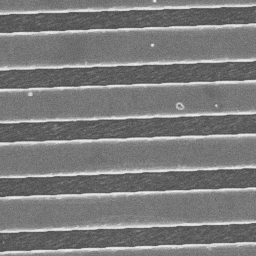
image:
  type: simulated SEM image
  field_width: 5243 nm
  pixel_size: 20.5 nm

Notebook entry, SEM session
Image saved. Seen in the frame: lines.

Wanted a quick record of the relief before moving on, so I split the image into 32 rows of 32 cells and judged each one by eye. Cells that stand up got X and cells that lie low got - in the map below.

XXXXXXXXXXXXXXXXXXXXXXXXXXXXXXXX
XXXXXXXXX-----------------------
--------------------------------
------------------XXXXXXXXXXXXXX
XXXXXXXXXXXXXXXXXXXXXXXXXXXXXXXX
XXXXXXXXXXXXXXXXXXXXXXXXXXXXXXXX
XXXXXXXXXXXXXXXXXXXXXXXXXXXXXXXX
XXXXXXXXXXXXXXXXXXXXXXXXXXXXXXXX
XXXXX---------------------------
--------------------------------
--------------------XXXXXXXXXXXX
XXXXXXXXXXXXXXXXXXXXXXXXXXXXXXXX
XXXXXXXXXXXXXXXXXXXXXXXXXXXXXXXX
XXXXXXXXXXXXXXXXXXXXXXXXXXXXXXXX
XXXXXXXXXXXXXXXXXXXXXX----------
--------------------------------
--------------------------------
------------XXXXXXXXXXXXXXXXXXXX
XXXXXXXXXXXXXXXXXXXXXXXXXXXXXXXX
XXXXXXXXXXXXXXXXXXXXXXXXXXXXXXXX
XXXXXXXXXXXXXXXXXXXXXXXXXXXXXXXX
XXXXXXXXXXXXXXXXXX--------------
--------------------------------
--------------------------------
----XXXXXXXXXXXXXXXXXXXXXXXXXXXX
XXXXXXXXXXXXXXXXXXXXXXXXXXXXXXXX
XXXXXXXXXXXXXXXXXXXXXXXXXXXXXXXX
XXXXXXXXXXXXXXXXXXXXXXXXXXXXXXXX
XXXXXXXXXXXXXXXX----------------
--------------------------------
--------------------------XXXXXX
XXXXXXXXXXXXXXXXXXXXXXXXXXXXXXXX